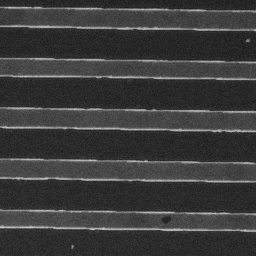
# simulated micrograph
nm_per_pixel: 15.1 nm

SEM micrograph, lines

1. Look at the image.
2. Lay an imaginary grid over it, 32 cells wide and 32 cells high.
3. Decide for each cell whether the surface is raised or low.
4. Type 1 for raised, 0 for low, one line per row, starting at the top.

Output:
00000000000000000000000000000000
11111111111111111111111111111111
11111111111111111111111111111111
00000000001111111111111111111111
00000000000000000000000000000000
00000000000000000000000000000000
00000000000000000000000000000000
11111111111110000000000000000000
11111111111111111111111111111111
00011111111111111111111111111111
00000000000000000000000000000000
00000000000000000000000000000000
00000000000000000000000000000000
00000000000000000000000000000000
11111111111111111111111111111111
11111111111111111111111111111111
00000000000000000000000000000000
00000000000000000000000000000000
00000000000000000000000000000000
00000000000000000000000000000000
11111111111111111111111111111111
11111111111111111111111111111111
00000000000000000011111111111111
00000000000000000000000000000000
00000000000000000000000000000000
00000000000000000000000000000000
11111111111111000000000000000000
11111111111111111111111111111111
00000001111111111111111111111111
00000000000000000000000000000000
00000000000000000000000000000000
00000000000000000000000000000000